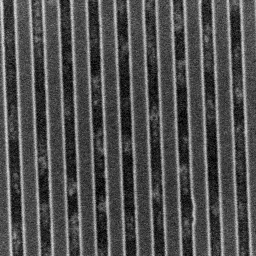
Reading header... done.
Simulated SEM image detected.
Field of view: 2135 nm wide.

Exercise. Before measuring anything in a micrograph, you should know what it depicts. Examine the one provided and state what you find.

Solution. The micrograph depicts parallel lines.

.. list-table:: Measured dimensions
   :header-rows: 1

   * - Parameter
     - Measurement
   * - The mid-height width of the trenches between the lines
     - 11.9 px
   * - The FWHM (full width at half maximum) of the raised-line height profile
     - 0.137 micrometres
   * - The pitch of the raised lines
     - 0.235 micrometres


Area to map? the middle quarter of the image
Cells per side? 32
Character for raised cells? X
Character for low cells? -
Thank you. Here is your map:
--XXXX---XXXX---XXXXX---XXXX---X
--XXXX---XXXX----XXXX---XXXX---X
--XXXX---XXXX----XXXX---XXXX---X
--XXXX----XXX----XXXX---XXXX---X
--XXXX----XXX----XXXX---XXXX---X
---XXX----XXXX---XXXX---XXXX---X
---XXX----XXXX---XXXX---XXXX---X
---XXX----XXXX---XXXX---XXXX---X
---XXXX---XXXX---XXXX---XXXX---X
---XXXX---XXXX---XXXX---XXXX---X
---XXXX---XXXX---XXXX---XXXX---X
---XXXX---XXXX---XXXX---XXXX---X
---XXXX---XXXX---XXXX---XXXX---X
---XXXX---XXXX---XXXX---XXXX---X
---XXXX---XXXX---XXXX---XXXX---X
---XXXX---XXXX---XXXX---XXXX---X
---XXXX---XXXX---XXXX---XXXX---X
---XXXX---XXXX---XXXX---XXXX---X
---XXXX---XXXX---XXXX---XXXX---X
---XXXX---XXXX---XXXX---XXXX---X
---XXXX---XXXX---XXXX---XXXX---X
---XXXX---XXXX---XXXX---XXXX---X
---XXXX---XXXX---XXXX---XXXX---X
---XXXX---XXXX---XXXX---XXXXX--X
---XXXX---XXXX----XXX---XXXXX---
---XXXX---XXXX----XXX---XXXXX---
---XXXX---XXXX---XXXXX---XXXX---
---XXXX---XXXX----XXXX---XXXX---
---XXXX---XXXX----XXXX---XXXX---
---XXXX----XXX----XXXX---XXXX---
X--XXXX----XXX----XXXX---XXXX---
----XXXX---XXX----XXXX---XXXX---